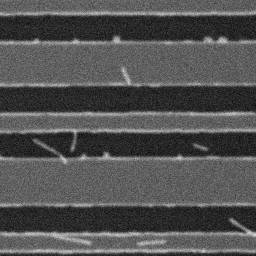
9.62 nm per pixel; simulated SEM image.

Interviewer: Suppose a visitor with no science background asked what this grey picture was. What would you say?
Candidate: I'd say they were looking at lines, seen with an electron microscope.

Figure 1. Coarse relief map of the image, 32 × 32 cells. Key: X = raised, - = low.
XXXXXXXXXXXXXXXXXXXXXXXXXXXXXXXX
XXXXXXXXXXXXXXXXXXXXXXXXXXXXXXXX
--------------------------------
--------------------------------
--------------------------------
XXXXXXXXXXXXXXXXXXXXXXXXXXXXXXXX
XXXXXXXXXXXXXXXXXXXXXXXXXXXXXXXX
XXXXXXXXXXXXXXXXXXXXXXXXXXXXXXXX
XXXXXXXXXXXXXXXXXXXXXXXXXXXXXXXX
XXXXXXXXXXXXXXXXXXXXXXXXXXXXXXXX
XXXXXXXXXXXXXXXXXXXXXXXXXXXXXXXX
--------------------------------
--------------------------------
--------------------------------
XXXXXXXXXXXXXXXXXXXXXXXXXXXXXXXX
XXXXXXXXXXXXXXXXXXXXXXXXXXXXXXXX
--------------------------------
--------------------------------
--------------------------------
--------------------------------
XXXXXXXXXXXXXXXXXXXXXXXXXXXXXXXX
XXXXXXXXXXXXXXXXXXXXXXXXXXXXXXXX
XXXXXXXXXXXXXXXXXXXXXXXXXXXXXXXX
XXXXXXXXXXXXXXXXXXXXXXXXXXXXXXXX
XXXXXXXXXXXXXXXXXXXXXXXXXXXXXXXX
XXXXXXXXXXXXXXXXXXXXXXXXXXXXXXXX
--------------------------------
--------------------------------
--------------------------------
XXXXXXXXXXXXXXXXXXXXXXXXXXXXXXXX
XXXXXXXXXXXXXXXXXXXXXXXXXXXXXXXX
--------------------------------